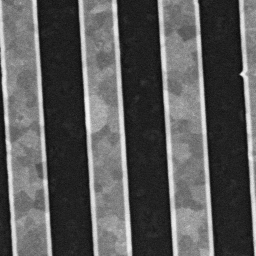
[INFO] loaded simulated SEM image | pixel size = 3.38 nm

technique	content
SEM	one or a few lines or trenches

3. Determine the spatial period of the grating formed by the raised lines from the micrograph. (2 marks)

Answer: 272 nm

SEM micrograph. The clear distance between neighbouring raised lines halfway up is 150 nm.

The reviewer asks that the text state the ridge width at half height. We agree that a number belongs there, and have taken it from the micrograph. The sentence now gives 118 nm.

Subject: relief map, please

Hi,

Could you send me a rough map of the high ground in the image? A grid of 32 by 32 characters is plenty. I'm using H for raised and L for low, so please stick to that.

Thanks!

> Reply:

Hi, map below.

HHHHLLLLLLHHHHLLLLLLHHHHLLLLLLHH
HHHHLLLLLLHHHHLLLLLLHHHHHLLLLLHH
HHHHLLLLLLHHHHLLLLLLHHHHHLLLLLHH
HHHHLLLLLLHHHHHLLLLLHHHHHLLLLLHH
HHHHHLLLLLHHHHHLLLLLHHHHHLLLLLHH
HHHHHLLLLLHHHHHLLLLLHHHHHLLLLLHH
HHHHHLLLLLLHHHHLLLLLHHHHHLLLLLLH
HHHHHLLLLLHHHHHLLLLLHHHHHLLLLLLH
HHHHHLLLLLLHHHHLLLLLHHHHHLLLLLLH
HHHHHLLLLLLHHHHLLLLLLHHHHLLLLLHH
HHHHHLLLLLLHHHHLLLLLLHHHHLLLLLLH
LHHHHLLLLLLHHHHLLLLLLHHHHLLLLLLH
LHHHHLLLLLLHHHHLLLLLLHHHHLLLLLLH
LHHHHLLLLLLHHHHLLLLLLHHHHLLLLLLH
LHHHHLLLLLLHHHHLLLLLLHHHHLLLLLLH
LHHHHLLLLLLHHHHLLLLLLHHHHLLLLLLH
LHHHHLLLLLLHHHHLLLLLLHHHHLLLLLLH
LHHHHLLLLLLHHHHLLLLLLHHHHHLLLLLH
LHHHHLLLLLLHHHHLLLLLLHHHHHLLLLLH
LHHHHLLLLLLHHHHHLLLLLHHHHHLLLLLH
LHHHHHLLLLLHHHHHLLLLLHHHHHLLLLLH
LHHHHHLLLLLHHHHHLLLLLHHHHHLLLLLH
LHHHHHLLLLLHHHHHLLLLLHHHHHLLLLLH
LHHHHHLLLLLHHHHHLLLLLHHHHHLLLLLL
LHHHHHLLLLLLHHHHLLLLLHHHHHLLLLLL
LLHHHHLLLLLLHHHHLLLLLLHHHHLLLLLL
LLHHHHLLLLLLHHHHLLLLLLHHHHLLLLLL
LLHHHHLLLLLLHHHHLLLLLLHHHHLLLLLL
LLHHHHLLLLLLHHHHLLLLLLHHHHLLLLLL
LLHHHHLLLLLLHHHHLLLLLLHHHHLLLLLL
LLHHHHLLLLLLHHHHLLLLLLHHHHLLLLLL
LLHHHHLLLLLLHHHHLLLLLLHHHHLLLLLL